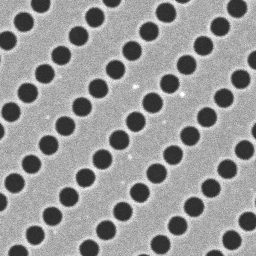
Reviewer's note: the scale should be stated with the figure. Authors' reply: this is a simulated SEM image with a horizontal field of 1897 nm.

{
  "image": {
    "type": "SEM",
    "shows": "a regular array of holes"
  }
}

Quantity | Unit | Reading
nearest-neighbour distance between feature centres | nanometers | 188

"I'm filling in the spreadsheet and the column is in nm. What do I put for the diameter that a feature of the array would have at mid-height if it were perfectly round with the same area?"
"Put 149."